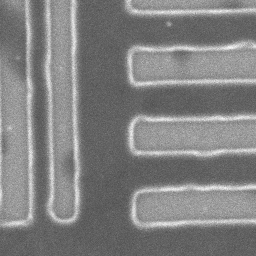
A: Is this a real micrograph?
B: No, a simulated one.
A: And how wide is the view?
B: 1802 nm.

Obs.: groups of lines, slits or small figures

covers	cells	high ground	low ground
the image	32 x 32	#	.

...###...#######................
...###...#######################
...###...#######################
...###...#######################
....##...#######################
...###...#######################
...###...########...............
...###...#######................
...###...#######................
...###...#######................
....##...#######################
....##...#######################
....##...#######################
....##...#######################
....##...#######################
....##...########...............
....##...#######................
....##...#######................
....##...########...............
....##...#######################
....##....######################
....##....######################
....###..#######################
....###..######################.
....###...#######...............
....##...########...............
....###..########...............
...##############...............
################################
################################
################################
################################